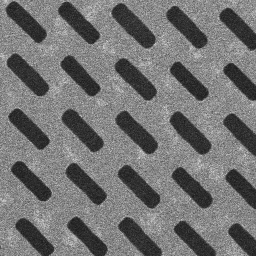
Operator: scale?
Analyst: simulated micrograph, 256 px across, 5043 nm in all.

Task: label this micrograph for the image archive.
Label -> a regular array of holes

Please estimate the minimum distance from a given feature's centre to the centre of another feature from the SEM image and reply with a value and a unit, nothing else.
1040 nm